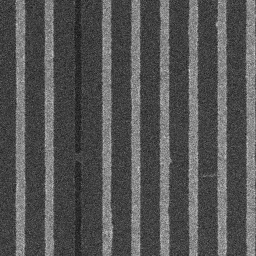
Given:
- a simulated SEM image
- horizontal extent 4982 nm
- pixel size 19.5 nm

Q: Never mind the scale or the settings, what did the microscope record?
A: parallel lines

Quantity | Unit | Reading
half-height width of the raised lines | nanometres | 153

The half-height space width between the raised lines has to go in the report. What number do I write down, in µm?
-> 0.404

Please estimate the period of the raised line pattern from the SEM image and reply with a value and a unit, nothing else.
561 nanometers